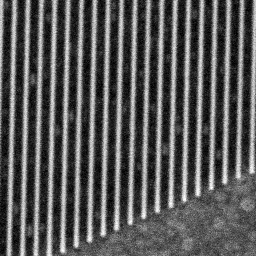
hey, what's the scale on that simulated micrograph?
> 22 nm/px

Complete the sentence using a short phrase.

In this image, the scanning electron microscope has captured parallel lines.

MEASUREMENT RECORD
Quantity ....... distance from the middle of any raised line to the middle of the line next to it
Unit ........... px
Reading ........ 13.4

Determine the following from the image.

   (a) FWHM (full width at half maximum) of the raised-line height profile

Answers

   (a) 60.5 nm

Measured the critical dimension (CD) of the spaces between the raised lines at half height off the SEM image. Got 217 nanometers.